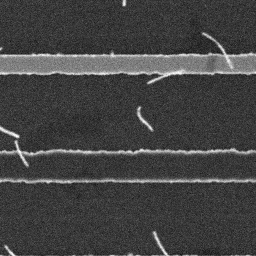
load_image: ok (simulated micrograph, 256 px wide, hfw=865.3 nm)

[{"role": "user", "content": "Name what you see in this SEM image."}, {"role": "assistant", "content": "lines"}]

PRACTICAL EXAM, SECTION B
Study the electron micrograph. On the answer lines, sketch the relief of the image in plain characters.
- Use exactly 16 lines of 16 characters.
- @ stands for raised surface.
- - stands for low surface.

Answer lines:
----------------
----------------
----------------
@@@@@@@@@@@@@@@@
@@@@@@@@@@@@@@@@
----------------
----------------
----------------
----------------
@@-@@@@@@@@@@@@@
@@@@@@@@@@@@@@@@
----------------
----------------
----------------
----------------
----------------